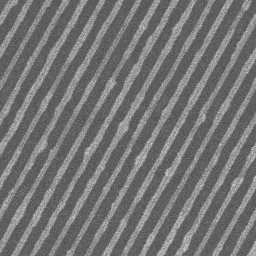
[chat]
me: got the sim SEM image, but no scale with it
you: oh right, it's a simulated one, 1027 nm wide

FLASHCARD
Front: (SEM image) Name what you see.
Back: parallel lines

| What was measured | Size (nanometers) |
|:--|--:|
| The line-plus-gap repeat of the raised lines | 63.6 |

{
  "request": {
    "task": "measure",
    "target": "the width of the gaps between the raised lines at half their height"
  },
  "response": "41.6 nm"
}